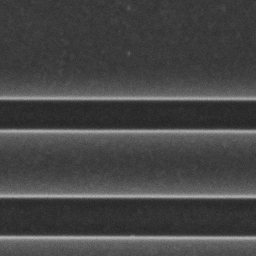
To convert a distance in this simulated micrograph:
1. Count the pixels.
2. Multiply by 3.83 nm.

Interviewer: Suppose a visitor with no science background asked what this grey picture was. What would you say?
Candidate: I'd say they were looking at one or a few lines or trenches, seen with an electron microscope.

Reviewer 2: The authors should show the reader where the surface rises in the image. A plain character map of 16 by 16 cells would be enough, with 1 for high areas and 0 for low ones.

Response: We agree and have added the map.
1111111111111111
1111111111111111
1111111111111111
1111111111111111
1111111111111111
1111111111111111
0000000000000000
0000000000000000
1111111111111111
1111111111111111
1111111111111111
1111111111111111
0000000000000000
0000000000000000
0000000000000000
1111111111111111